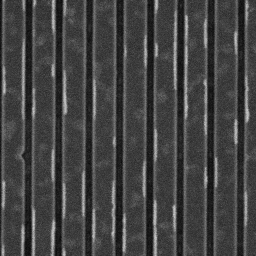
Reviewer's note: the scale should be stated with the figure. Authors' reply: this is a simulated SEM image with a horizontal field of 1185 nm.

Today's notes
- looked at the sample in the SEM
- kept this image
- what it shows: parallel lines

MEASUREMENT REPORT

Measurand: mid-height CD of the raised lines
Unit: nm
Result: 107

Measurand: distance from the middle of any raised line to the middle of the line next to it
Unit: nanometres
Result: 141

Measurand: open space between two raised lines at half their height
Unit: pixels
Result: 7.62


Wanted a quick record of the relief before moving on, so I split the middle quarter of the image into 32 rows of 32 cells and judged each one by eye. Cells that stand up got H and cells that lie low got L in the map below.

HHHHHLLHHHHHHLLHHHHHLLLHHHHHLLHH
HHHHHLLHHHHHHLLHHHHHLLLHHHHHLLHH
HHHHHLLHHHHHHLLHHHHHLLLHHHHHLLHH
HHHHHLLHHHHHHLLHHHHHLLLHHHHHLLHH
HHHHHLLHHHHHHLLHHHHHLLLHHHHHLLHH
HHHHHLLHHHHHHLLHHHHHLLLHHHHHLLHH
HHHHHLLHHHHHHLLHHHHHLLLHHHHHLLHH
HHHHHLLHHHHHHLLHHHHHLLLHHHHHLLHH
HHHHHLLHHHHHHLLHHHHHLLLHHHHHLLHH
HHHHHLLHHHHHHLLHHHHHLLLHHHHHLLHH
HHHHHLLHHHHHHLLHHHHHLLLHHHHHLLHH
HHHHHLLHHHHHHLLHHHHHLLLHHHHHLLHH
HHHHHLLHHHHHHLLHHHHHLLLHHHHHLLHH
HHHHHLLHHHHHHLLHHHHHLLLHHHHHLLHH
HHHHHLLHHHHHHLLHHHHHLLLHHHHHLLHH
HHHHHLLHHHHHHLLHHHHHLLLHHHHHLLHH
HHHHHLLHHHHHHLLHHHHHLLLHHHHHLLHH
HHHHHLLHHHHHHLLHHHHHLLLHHHHHLLHH
HHHHHLLHHHHHHLLHHHHHLLLHHHHHLLHH
HHHHHLLHHHHHHLLHHHHHLLLHHHHHLLHH
HHHHHLLHHHHHHLLHHHHHLLLHHHHHLLHH
HHHHHLLHHHHHHLLHHHHHLLLHHHHHLLHH
HHHHHLLHHHHHHLLHHHHHLLLHHHHHLLHH
HHHHHLLHHHHHHLLHHHHHLLLHHHHHLLHH
HHHHHLLHHHHHHLLHHHHHLLLHHHHHLLHH
HHHHHLLHHHHHHLLHHHHHLLLHHHHHLLHH
HHHHHLLHHHHHHLLHHHHHLLLHHHHHLLHH
HHHHHLLHHHHHHLLHHHHHLLLHHHHHLLHH
HHHHHLLHHHHHHLLHHHHHLLLHHHHHLLHH
HHHHHLLHHHHHHLLHHHHHLLLHHHHHLLHH
HHHHHLLHHHHHHLLHHHHHLLLHHHHHLLHH
HHHHHLLHHHHHHLLHHHHHLLLHHHHHLLHH